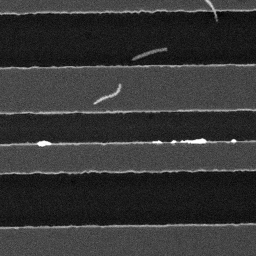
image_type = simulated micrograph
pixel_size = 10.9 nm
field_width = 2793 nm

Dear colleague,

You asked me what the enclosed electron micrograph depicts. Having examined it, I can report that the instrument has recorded lines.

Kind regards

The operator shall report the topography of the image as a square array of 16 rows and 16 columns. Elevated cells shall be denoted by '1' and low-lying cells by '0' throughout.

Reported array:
1111111111111111
0000000000000000
0000000000000000
0000000000000000
1111111111111111
1111111111111111
1111111111111111
1111111111111111
1111111111111111
1111111111111111
1111111111111111
0000000000000000
0000000000000000
0000000000000000
1111111111111111
1111111111111111